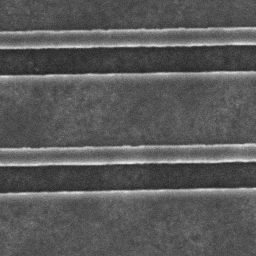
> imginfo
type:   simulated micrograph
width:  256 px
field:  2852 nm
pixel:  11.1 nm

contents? lines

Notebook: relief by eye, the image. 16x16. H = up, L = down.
HHHHHHHHHHHHHHHH
HHHHHHHHHHHHHHHH
HHHHHHHHHHHHHHHH
LLLLLLLLLLLLLLLL
LLLLLLLLLLLLLLLL
HHHHHHHHHHHHHHHH
HHHHHHHHHHHHHHHH
HHHHHHHHHHHHHHHH
HHHHHHHHHHHHHHHH
HHHHHHHHHHHHHHHH
LLLLLLLLLLLLLLLL
LLLLLLLLLLLLLLLL
HHHHHHHHHHHHHHHH
HHHHHHHHHHHHHHHH
HHHHHHHHHHHHHHHH
HHHHHHHHHHHHHHHH